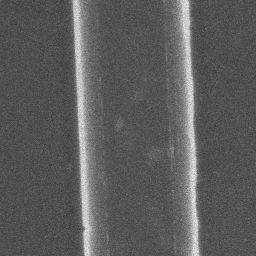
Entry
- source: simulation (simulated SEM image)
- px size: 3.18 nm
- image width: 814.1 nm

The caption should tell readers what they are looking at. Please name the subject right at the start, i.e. one or a few lines or trenches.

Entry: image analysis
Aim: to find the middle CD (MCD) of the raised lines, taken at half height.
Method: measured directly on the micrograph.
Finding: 348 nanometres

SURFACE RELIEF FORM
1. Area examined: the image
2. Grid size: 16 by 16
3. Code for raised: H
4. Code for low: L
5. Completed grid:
LLLLLHHHHHHHLLLL
LLLLLHHHHHHHLLLL
LLLLLHHHHHHHLLLL
LLLLLHHHHHHHLLLL
LLLLLHHHHHHHLLLL
LLLLLHHHHHHHLLLL
LLLLLHHHHHHHLLLL
LLLLLHHHHHHHLLLL
LLLLLHHHHHHHLLLL
LLLLLHHHHHHHLLLL
LLLLLHHHHHHHLLLL
LLLLLHHHHHHHLLLL
LLLLLHHHHHHHLLLL
LLLLLHHHHHHHLLLL
LLLLLHHHHHHHLLLL
LLLLLHHHHHHHLLLL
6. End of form